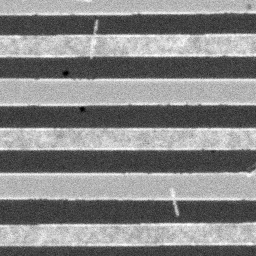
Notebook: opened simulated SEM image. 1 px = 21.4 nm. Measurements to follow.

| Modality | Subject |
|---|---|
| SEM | lines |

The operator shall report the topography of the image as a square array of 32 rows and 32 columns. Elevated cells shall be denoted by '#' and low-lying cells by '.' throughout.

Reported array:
################################
############################.##.
................................
................................
...........#.......#############
################################
################################
................................
................................
................................
################################
################################
################################
................................
................................
................................
################################
################################
################################
................................
................................
................................
################################
################################
################################
................................
................................
................................
################################
################################
#####################.#####.....
................................